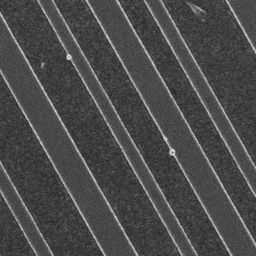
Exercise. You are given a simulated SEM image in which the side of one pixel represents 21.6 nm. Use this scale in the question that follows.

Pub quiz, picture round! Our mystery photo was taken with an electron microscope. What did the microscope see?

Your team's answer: lines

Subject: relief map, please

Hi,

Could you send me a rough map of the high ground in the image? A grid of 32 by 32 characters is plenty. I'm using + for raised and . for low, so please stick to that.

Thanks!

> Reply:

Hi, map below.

.....++....++++...++.........+++
.....++.....++++...++...+....+++
+.....++....++++...+++........++
+......++....++++...++........++
++.....++....++++....++........+
++......++....++++...++........+
+++.....++....++++....++........
+++......++....++++...++........
++++.....++.....+++....++.......
+++++.....++....++++...+++......
.++++......++....++++...++......
.+++++.....++....++++....++.....
..++++......++....++++...++.....
...++++.....++....++++....++....
...++++......++....++++...++....
....++++.....++.....+++....++...
....++++......++....++++...++...
.....++++......++....++++...++..
.....+++++.....++....++++...+++.
......++++......++....++++...++.
.......++++.....++....++++....++
+......++++......++....++++...++
+.......++++.....++.....+++....+
++......++++......++....++++...+
++.......++++......++....++++...
.++......+++++.....++....++++...
.+++......++++......++....++++..
..++.......++++.....++....++++..
...++......++++......++....++++.
...++.......++++.....++....++++.
....++......++++......++....++++
....++.......++++.....++.....+++